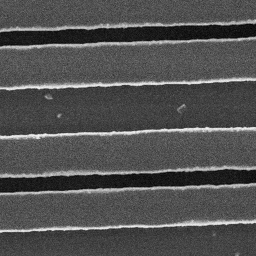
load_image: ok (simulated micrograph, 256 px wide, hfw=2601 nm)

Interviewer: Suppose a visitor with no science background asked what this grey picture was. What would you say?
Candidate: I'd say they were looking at lines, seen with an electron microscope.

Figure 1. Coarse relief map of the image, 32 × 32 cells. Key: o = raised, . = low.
oooooooooooooooooooooooooooooooo
oooooooooooooooooooooooooooooooo
oooooooooooooooooooooooooooooooo
ooooooooooooo...................
................................
...........ooooooooooooooooooooo
oooooooooooooooooooooooooooooooo
oooooooooooooooooooooooooooooooo
oooooooooooooooooooooooooooooooo
oooooooooooooooooooooooooooooooo
ooooooooooooooooooooo...........
................................
................................
................................
................................
................................
.................ooooooooooooooo
oooooooooooooooooooooooooooooooo
oooooooooooooooooooooooooooooooo
oooooooooooooooooooooooooooooooo
oooooooooooooooooooooooooooooooo
oooooooooooooooooooo............
................................
...............ooooooooooooooooo
oooooooooooooooooooooooooooooooo
oooooooooooooooooooooooooooooooo
oooooooooooooooooooooooooooooooo
oooooooooooooooooooooooooooooooo
oooooooooooooo..................
................................
................................
................................